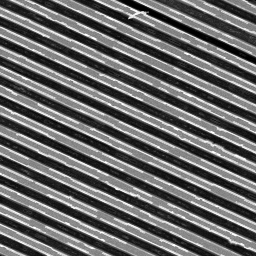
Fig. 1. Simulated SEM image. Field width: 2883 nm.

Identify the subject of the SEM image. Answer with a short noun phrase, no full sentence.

parallel lines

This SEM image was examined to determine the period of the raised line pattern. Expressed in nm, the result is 202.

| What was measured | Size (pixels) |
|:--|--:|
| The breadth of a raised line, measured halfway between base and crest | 9.65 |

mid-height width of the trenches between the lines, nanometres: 88.2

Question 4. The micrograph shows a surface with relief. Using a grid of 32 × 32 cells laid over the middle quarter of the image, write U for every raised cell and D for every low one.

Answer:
UUUUUUDDDDDUUUUUDDDDDDUUUUUDDDDD
DDDUUUUUDDDDDUUUUUUDDDDUUUUUUUDD
DDDDDUUUUUDDDDDUUUUUUDDDDDUUUUUU
UUDDDDUUUUUUDDDDDDUUUUUDDDDDUUUU
UUUUDDDDDUUUUUUDDDDDUUUUUDDDDDUU
UUUUUUDDDDDUUUUUDDDDDDUUUUUDDDDD
DDUUUUUUDDDDDUUUUUUDDDDDUUUUUDDD
DDDDDUUUUUDDDDDDUUUUUDDDDDUUUUUU
UUDDDDDUUUUUDDDDDDUUUUUDDDDDUUUU
UUUUDDDDDUUUUUUDDDDDUUUUUDDDDDUU
DUUUUUDDDDDUUUUUUDDDDDUUUUUDDDDD
DDDUUUUUDDDDDUUUUUUDDDDDUUUUUDDD
DDDDDUUUUUUDDDDUUUUUUDDDDDDUUUUU
UUDDDDDUUUUUUDDDDDUUUUUDDDDDDUUU
UUUUDDDDDUUUUUUDDDDDUUUUUDDDDDDU
DUUUUUDDDDDDUUUUUDDDDDUUUUUUDDDD
DDDUUUUUDDDDDDUUUUUDDDDDUUUUUUDD
DDDDDUUUUUDDDDDUUUUUUUDDDDUUUUUU
UUDDDDDUUUUUUDDDDDUUUUUUDDDDDUUU
UUUUDDDDDUUUUUUDDDDDUUUUUUDDDDDU
DUUUUUUDDDDUUUUUUDDDDDUUUUUUDDDD
DDDUUUUUUDDDDDUUUUUDDDDDUUUUUUDD
DDDDDUUUUUUDDDDDUUUUUDDDDDDUUUUU
UUDDDDDUUUUUUDDDDDUUUUUUDDDDDUUU
UUUUDDDDDUUUUUUDDDDDUUUUUUDDDDDU
DUUUUUDDDDDDUUUUUDDDDDUUUUUUDDDD
DDDUUUUUUDDDDDUUUUUDDDDDUUUUUUDD
DDDDDUUUUUUDDDDDUUUUUUDDDDDUUUUU
UUDDDDDUUUUUUDDDDDUUUUUUDDDDDUUU
UUUUDDDDDDUUUUUDDDDDDUUUUUDDDDDU
DUUUUUDDDDDDUUUUUDDDDDUUUUUUDDDD
DDDUUUUUDDDDDDUUUUUDDDDDDUUUUUDD